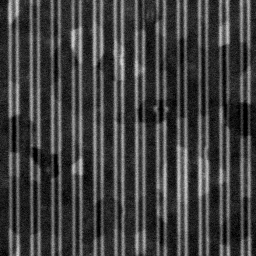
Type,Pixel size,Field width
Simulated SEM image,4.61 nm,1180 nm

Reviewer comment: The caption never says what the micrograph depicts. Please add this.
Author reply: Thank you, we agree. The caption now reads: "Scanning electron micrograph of parallel lines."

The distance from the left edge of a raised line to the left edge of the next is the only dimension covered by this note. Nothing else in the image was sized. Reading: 97 nm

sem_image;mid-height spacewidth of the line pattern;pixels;13.6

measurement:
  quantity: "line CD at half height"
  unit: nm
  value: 31.7